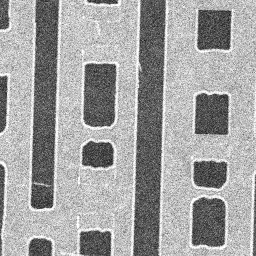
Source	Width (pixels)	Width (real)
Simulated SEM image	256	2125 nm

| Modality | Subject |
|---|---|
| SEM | parallel lines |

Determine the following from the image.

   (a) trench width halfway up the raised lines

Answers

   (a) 0.224 micrometres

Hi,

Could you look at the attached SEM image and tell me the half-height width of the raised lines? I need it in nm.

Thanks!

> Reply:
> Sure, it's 210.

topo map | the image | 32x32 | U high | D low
DUUUDDDDUUUDDDDUUDDDDUUUUUUUUUUU
DUUUDDDDUUUUUUUUUDDDDUUUUDDDDUUU
DUUUDDDDUUUUUUUUUDDDDUUUUDDDDUUU
DUUUDDDDUUUUUUUUUDDDDUUUUDDDDUUU
UUUUDDDUUUUUUUUUUDDDDUUUUDDDDUUU
UUUUDDDUUUUUUUUUUDDDDUUUUDDDDUUU
UUUUDDDUUUUUUUUUUDDDDUUUUUUUUUUU
UUUUDDDUUUUUUUUUUDDDDUUUUUUUUUUU
UUUUDDDUUUDDDDDUUDDDDUUUUUUUUUUU
DUUUDDDUUUDDDDDUUDDDDUUUUUUUUUUU
DUUUDDDUUUDDDDDUUDDDDUUUUUUUUUUU
DUUUDDDUUUDDDDDUUDDDDUUUUUUUUUUU
DUUUDDDUUUDDDDDUUDDDDUUUDDDDDUUU
DUUUDDDUUUDDDDDUUDDDUUUUDDDDDUUU
DUUUDDDUUUDDDDDUUDDDUUUUDDDDDUUU
DUUUDDDUUUUDDDUUUDDDUUUUDDDDDUUU
UUUUDDDUUUUUUUUUUDDDUUUUDDDDDUUU
UUUUDDDUUUUUUUUUUDDDUUUUUUUUUUUU
UUUUDDDUUUDDDDUUUDDDUUUUUUUUUUUU
UUUUDDDUUUDDDDUUUDDDUUUUUUUUUUUU
UUUUDDDUUUDDDDUUUDDDUUUUDDDDUUUU
DUUUDDDUUUUUUUUUUDDDUUUUDDDDUUUU
DUUUDDDUUUUUUUUUUDDDUUUUDDDDUUUU
DUUUDDDUUUUUUUUUUDDDUUUUUUDDUUUU
DUUUDDDUUUUUUUUUUDDDUUUUUUUUUUUU
DUUUDDDUUUUUUUUUUDDDUUUUDDDDUUUU
DUUUUUUUUUUUUUUUUDDDUUUUDDDDUUUU
DUUUUUUUUUUUUUUUUDDDUUUUDDDDUUUU
UUUUUUUUUUUUUUUUUDDDUUUUDDDDUUUD
UUUUUUUUUUDDDDUUUDDDUUUUDDDDUUUU
UUUUDDDUUUDDDDUUUDDDUUUUDDDDUUUD
UUUDDDDUUUDDDDUUUDDDUUUUUUUUUUUD